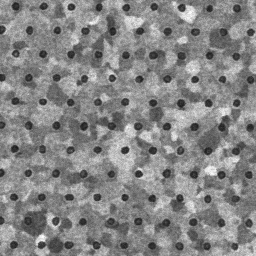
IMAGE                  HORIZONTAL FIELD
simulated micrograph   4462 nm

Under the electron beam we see a regular array of holes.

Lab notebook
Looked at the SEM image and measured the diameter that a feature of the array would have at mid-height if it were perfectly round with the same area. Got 151 nanometers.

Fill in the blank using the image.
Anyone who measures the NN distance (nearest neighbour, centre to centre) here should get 0.473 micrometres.